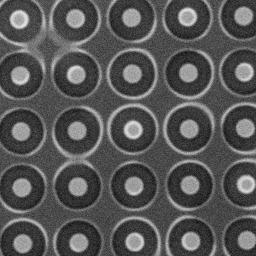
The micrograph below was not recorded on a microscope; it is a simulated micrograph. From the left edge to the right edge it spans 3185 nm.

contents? an array of small figures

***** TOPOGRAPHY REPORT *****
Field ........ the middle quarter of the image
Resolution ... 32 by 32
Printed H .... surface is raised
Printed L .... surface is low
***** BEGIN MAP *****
LLLLLLLLLHHLLLLLHHLLLLLHHLLLLLHH
LLHHHLLLLHHLLLLHHHHLLLLHHLLLLHHH
LHHHHLLLLHHLLLLHHHHLLLLHHLLLLHHH
LHHHHLLLLHHLLLLHHHHLLLLHHLLLLHHH
LLHHLLLLLHHHLLLLHHLLLLLHHHLLLLLL
LLLLLLLLHHHHLLLLLLLLLLHHHHLLLLLL
LLLLLLLHHHHHHLLLLLLLLLHHHHHLLLLL
LLLLLLLHHHHHHHLLLLLLLHHHHHHHLLLL
HHLLHHHHHHHHHHHHLHHHHHHHHHHHHHHL
HHHHHHHHHHHHHHHHHHHHHHHHHHHHHHHH
HHHHHHHHHHHHHHHHLLLHHHHHHHHHHLLL
HLLLLLLHHHHHHHLLLLLLLHHHHHHHLLLL
LLLLLLLLHHHHHLLLLLLLLLHHHHLLLLLL
LLLLLLLLLHHHLLLLLLLLLLLHHHLLLLLL
LLLLLLLLLHHLLLLLLLLLLLLHHLLLLLHH
LHHHHLLLLHHLLLLLHHHLLLLHHLLLLHHH
LHHHHLLLLLHLLLLLHHHLLLLHHLLLLHHH
LHHHHLLLLHHLLLLLHHHLLLLHHLLLLLHH
LLHHLLLLLHHHLLLLLLLLLLLHHHLLLLLL
LLLLLLLLLHHHLLLLLLLLLLHHHHLLLLLL
LLLLLLLLHHHHHLLLLLLLLHHHHHHLLLLL
LLLLLLLHHHHHHHLLLLLLHHHHHHHHLLLL
HLLLLLHHHHHHHHHHHHHHHHHHHHHHHHHH
HHHHHHHHHHHHHHHHHHHHHHHHHHHHHHHH
HHLLLHHHHHHHHHHHHLHHHHHHHHHHHHLL
LLLLLLLHHHHHHHLLLLLLLHHHHHHHLLLL
LLLLLLLLHHHHHLLLLLLLLLHHHHHLLLLL
LLLLLLLLLHHHLLLLLLLLLLLHHHLLLLLL
LLLLLLLLLHHHLLLLLHLLLLLHHHLLLLHH
LLHHHLLLLHHHLLLLHHHLLLLHHHLLLLHH
LHHHHHLLLLHLLLLHHHHHLLLHHHLLLHHH
LHHHHHLLLHHHLLLLHHHLLLLHHHLLLLHH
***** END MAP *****